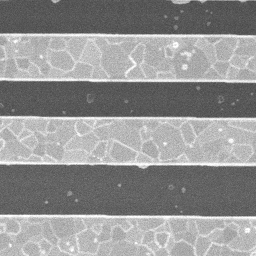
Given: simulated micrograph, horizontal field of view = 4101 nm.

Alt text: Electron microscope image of lines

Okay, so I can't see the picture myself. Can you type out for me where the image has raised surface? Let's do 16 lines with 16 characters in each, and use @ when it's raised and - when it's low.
----------------
----------------
@@@@@@@@@@@@@@@@
@@@@@@@@@@@@@@@@
@@@@@@@@@@@@@@@@
----------------
----------------
@@@@@@@@@@@@@@@@
@@@@@@@@@@@@@@@@
@@@@@@@@@@@@@@@@
----------------
----------------
----------------
@@@@@@@---------
@@@@@@@@@@@@@@@@
@@@@@@@@@@@@@@@@